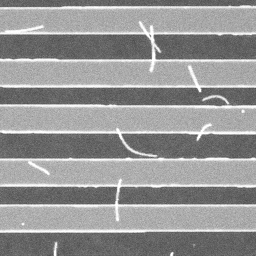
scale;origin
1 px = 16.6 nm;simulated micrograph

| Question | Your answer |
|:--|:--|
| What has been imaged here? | lines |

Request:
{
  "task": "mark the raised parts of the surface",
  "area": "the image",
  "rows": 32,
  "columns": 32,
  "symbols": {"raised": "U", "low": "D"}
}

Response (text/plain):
DDDDDDDDDDDDDDDDDDDDDDDDDDDDDDDD
UUUUUUUUUUUUUUUUUUUUUUUUUUUUUUUU
UUUUUUUUUUUUUUUUUUUUUUUUUUUUUUUU
UUUUUUUUUUUUUUUUUUUUUUUUUUUUUUUU
DDDDDDDDDDDDDDDDDDDDDDDDDDDDDDDD
DDDDDDDDDDDDDDDDDDDDDDDDDDDDDDDD
DDDDDDDDDDDDDDDDDDDDDDDDDDDDDDDD
UUUUUUUUDDDDDDDDDDDUDDDDDDDDDDDD
UUUUUUUUUUUUUUUUUUUUUUUUUUUUUUUU
UUUUUUUUUUUUUUUUUUUUUUUUUUUUUUUU
UUUUUUUUUUUUUUUUUUUUUUUUUUUUUUUU
DDDDDDDDDDDDDDDDDDDDDDDDDDDDDDDD
DDDDDDDDDDDDDDDDDDDDDDDDDDDDDDDD
UUUUUUUUUUUUUUUUUUUUUUUUUUUUUUUU
UUUUUUUUUUUUUUUUUUUUUUUUUUUUUUUU
UUUUUUUUUUUUUUUUUUUUUUUUUUUUUUUU
UUUUUUUUUUUUUUUUUUUUUUUUUUUUUUUU
DDDDDDDDDDDDDDDDDDDDDDDDDDDDDDDD
DDDDDDDDDDDDDDDDDDDDDDDDDDDDDDDD
DDDDDDDDDDDDDDDDDDDDDDDDDDDDDDDD
UUUUUUUUUUUUUUUUUUUUUUUUUUUUUUUU
UUUUUUUUUUUUUUUUUUUUUUUUUUUUUUUU
UUUUUUUUUUUUUUUUUUUUUUUUUUUUUUUU
DDDDDDDDDDDDDDDDDDDDDDDDDDDDDDDD
DDDDDDDDDDDDDDDDDDDDDDDDDDDDDDDD
DDDDDDDDDDDDDDDDDDDDDDDDDDDDDDDD
UUUUUUUUUUUUUUUUUUUUUUUUUUUUUUUU
UUUUUUUUUUUUUUUUUUUUUUUUUUUUUUUU
UUUUUUUUUUUUUUUUUUUUUUUUUUUUUUUU
DDDDDDDDDDDDDDDDDDDDDDDDDDDDDDDD
DDDDDDDDDDDDDDDDDDDDDDDDDDDDDDDD
DDDDDDDDDDDDDDDDDDDDDDDDDDDDDDDD